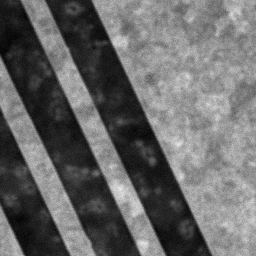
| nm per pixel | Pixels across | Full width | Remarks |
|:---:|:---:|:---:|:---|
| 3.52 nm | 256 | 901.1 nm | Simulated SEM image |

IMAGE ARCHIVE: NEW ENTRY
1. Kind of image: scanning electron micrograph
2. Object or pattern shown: one or a few lines or trenches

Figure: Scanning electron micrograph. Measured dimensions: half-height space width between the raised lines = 0.154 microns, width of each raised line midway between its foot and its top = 72.2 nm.